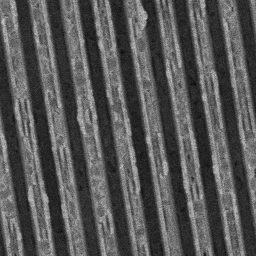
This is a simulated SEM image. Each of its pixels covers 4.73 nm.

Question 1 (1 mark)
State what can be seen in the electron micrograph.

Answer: parallel lines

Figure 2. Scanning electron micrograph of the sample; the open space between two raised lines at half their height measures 14.8 px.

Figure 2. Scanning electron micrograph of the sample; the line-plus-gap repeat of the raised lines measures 148 nanometres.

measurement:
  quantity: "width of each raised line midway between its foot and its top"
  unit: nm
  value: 74.7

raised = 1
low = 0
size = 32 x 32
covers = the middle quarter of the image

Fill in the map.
00111100001111000011100000111000
00111100001111000011110000111100
00111100001111000011110000111100
00111100001111000011110000111100
00011100000111000001110000111100
00011110000111100001110000111100
00011110000111100001110000011100
00011110000111100001111000011110
00011110000111100001111000011110
00011111000111100001111000011110
00001111000011100000111000011110
00011111000011110000111000011110
00011111000011110000111000001110
00011111000011110000111100001111
00001111000011110000111100001111
00001111000011110000111100001111
00001111000001111000111100001111
10000111100001111000011100001111
10000111100001111000011100000111
10000111100001111000011110000111
10000111100001111000011110000111
10000111100001111000011110000111
10000011100001111100011110000111
11000011110000111100001110000111
11000011110000111100001111000111
11000011110000111100001111000111
11000011110000111100001111000011
11000011110000111100001111000011
11000011110000111110001111000011
11100001111000011110000111000011
11100001111000011110000111000011
11100001111000011110000111100011